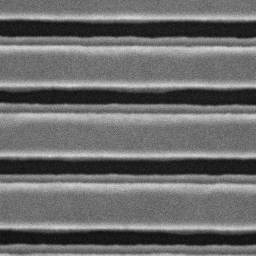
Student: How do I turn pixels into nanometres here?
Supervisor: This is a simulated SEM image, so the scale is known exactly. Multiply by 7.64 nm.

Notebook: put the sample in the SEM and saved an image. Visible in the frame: lines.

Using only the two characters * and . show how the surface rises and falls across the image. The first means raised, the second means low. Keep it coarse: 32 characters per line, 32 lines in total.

********************************
********************************
..............................*.
................................
................................
********************************
********************************
********************************
********************************
********************************
********************************
................................
................................
********************************
********************************
********************************
********************************
********************************
********************************
********************************
................................
................................
********************************
********************************
********************************
********************************
********************************
********************************
********************************
................................
................................
********************************